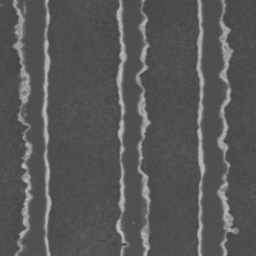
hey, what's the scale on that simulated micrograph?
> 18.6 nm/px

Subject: one or a few lines or trenches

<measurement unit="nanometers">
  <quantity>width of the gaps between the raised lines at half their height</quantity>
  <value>1230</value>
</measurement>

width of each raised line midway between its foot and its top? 456 nm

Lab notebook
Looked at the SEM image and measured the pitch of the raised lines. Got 1660 nm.